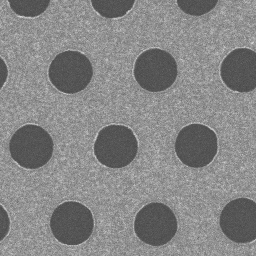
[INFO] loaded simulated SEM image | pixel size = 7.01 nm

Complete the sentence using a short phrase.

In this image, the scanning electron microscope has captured holes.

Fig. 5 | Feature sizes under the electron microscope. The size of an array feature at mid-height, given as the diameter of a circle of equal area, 43.6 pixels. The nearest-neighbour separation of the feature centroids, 586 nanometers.